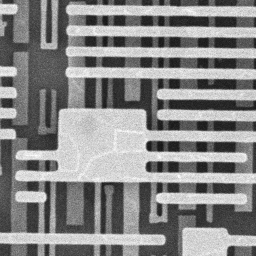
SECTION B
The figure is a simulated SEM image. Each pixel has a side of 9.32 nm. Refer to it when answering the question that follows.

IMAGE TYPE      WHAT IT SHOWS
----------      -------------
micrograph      wiring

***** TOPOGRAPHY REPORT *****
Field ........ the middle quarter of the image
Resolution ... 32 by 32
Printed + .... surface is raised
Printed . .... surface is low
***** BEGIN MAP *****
................................
.+++++++++++++++++++++++++++++++
++++++++++++++++++++++++++++++++
...................+++++++++++++
................................
................................
........................++++++++
.......................+++++++++
........................++++++++
................................
................................
++++++++++++++++++++....++++....
++++++++++++++++++++....++++++++
++++++++++++++++++++....++++++++
++++++++++++++++++++............
+++++++++++++++++++++...........
+++++++++++++++++++++...........
++++++++++++++++++++++++++++++++
++++++++++++++++++++++++++++++++
+++++++++++++++++++++...........
++++++++++++++++++++............
+++++++++++++++++++++...........
++++++++++++++++++++++++++++++++
++++++++++++++++++++++++++++++++
+++++++++++++++++++++...........
++++++++++++++++++++............
++++++++++++++++++++............
++++++++++++++++++++++++++++++++
++++++++++++++++++++++++++++++++
..............++++.....+++++++++
................................
................................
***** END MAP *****